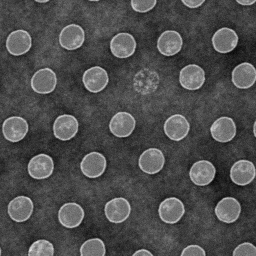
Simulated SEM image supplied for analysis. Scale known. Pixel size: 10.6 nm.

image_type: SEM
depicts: a regular array of raised bodies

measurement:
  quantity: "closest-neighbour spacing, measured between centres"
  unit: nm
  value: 490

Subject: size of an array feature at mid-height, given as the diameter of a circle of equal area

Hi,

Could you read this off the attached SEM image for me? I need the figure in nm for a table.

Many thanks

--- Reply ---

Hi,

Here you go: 263